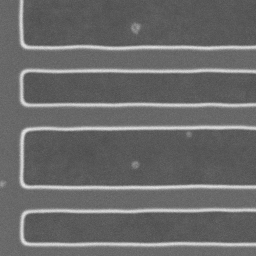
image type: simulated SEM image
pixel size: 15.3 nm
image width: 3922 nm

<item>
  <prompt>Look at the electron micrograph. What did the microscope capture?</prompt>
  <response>groups of lines, slits or small figures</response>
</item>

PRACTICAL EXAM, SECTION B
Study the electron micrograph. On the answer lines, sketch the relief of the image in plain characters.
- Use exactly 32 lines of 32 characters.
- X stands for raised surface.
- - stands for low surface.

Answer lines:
XXX-----------------------------
XXX-----------------------------
XXX-----------------------------
XXX-----------------------------
XXX-----------------------------
XXX-----------------------------
XXXXXXXXXXXXXXXXXXXXXXXXXXXXXXXX
XXXXXXXXXXXXXXXXXXXXXXXXXXXXXXXX
XXXXXXXXXXXXXXXXXXXXXXXXXXXXXXXX
XXX-----------------------------
XXX-----------------------------
XXX-----------------------------
XXX-----------------------------
XXXXXXXXXXXXXXXXXXXXXXXXXXXXXXXX
XXXXXXXXXXXXXXXXXXXXXXXXXXXXXXXX
XXXXXXXXXXXXXXXXXXXXXXXXXXXXXXXX
XXX-----------------------------
XXX-----------------------------
XXX-----------------------------
XXX-----------------------------
XXX-----------------------------
XXX-----------------------------
XXX-----------------------------
XXXXXXXXXXXXXXXXXXXXXXXXXXXXXXXX
XXXXXXXXXXXXXXXXXXXXXXXXXXXXXXXX
XXXXXXXXXXXXXXXXXXXXXXXXXXXXXXXX
XXXX----------------------------
XXX-----------------------------
XXX-----------------------------
XXX-----------------------------
XXXX------------------XX--------
XXXXXXXXXXXXXXXXXXXXXXXXXXXXXXXX